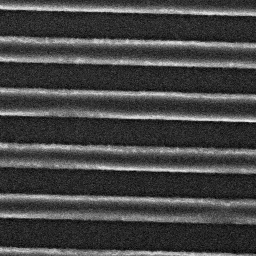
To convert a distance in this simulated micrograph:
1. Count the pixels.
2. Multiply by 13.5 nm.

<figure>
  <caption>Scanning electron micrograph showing lines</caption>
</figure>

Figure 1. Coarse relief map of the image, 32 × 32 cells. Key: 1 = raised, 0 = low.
11111111111111111111111111111111
00000000000000000000111111111111
00000000000000000000000000000000
00000000000000000000000000000000
00000000000000000000000000000000
11111111111111111111111111100000
11111111111111111111111111111111
00011111111111111111111111111111
00000000000000000000000000000000
00000000000000000000000000000000
00000000000000000000000000000000
11111100000000000000000000000000
11111111111111111111111111111111
11111111111111111111111111111111
00000000000001111111111111111111
00000000000000000000000000000000
00000000000000000000000000000000
00000000000000000000000000000000
11111111111110000000000000000000
11111111111111111111111111111111
11111111111111111111111111111111
00000000000000000000000000000000
00000000000000000000000000000000
00000000000000000000000000000000
00000000000000000000000000000000
11111111111111111111111111111111
11111111111111111111111111111111
00000000000000000000000000000111
00000000000000000000000000000000
00000000000000000000000000000000
00000000000000000000000000000000
11111111100000000000000000000000